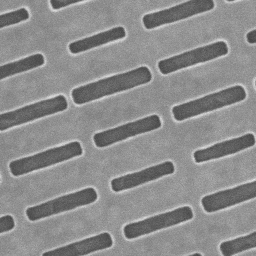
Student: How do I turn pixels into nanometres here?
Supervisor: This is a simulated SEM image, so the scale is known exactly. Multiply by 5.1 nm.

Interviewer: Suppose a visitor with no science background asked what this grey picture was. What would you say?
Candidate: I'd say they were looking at a regular array of holes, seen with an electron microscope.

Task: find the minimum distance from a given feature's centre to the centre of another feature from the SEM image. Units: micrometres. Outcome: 0.247